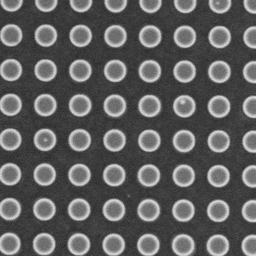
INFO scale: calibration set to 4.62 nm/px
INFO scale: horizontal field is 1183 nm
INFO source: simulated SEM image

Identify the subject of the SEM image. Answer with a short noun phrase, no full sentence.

an array of small figures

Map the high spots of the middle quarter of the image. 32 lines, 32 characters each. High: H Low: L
LLHHHHHLLLHHHHHLLLLHHHHHLLLLHHHH
LHHHHHHLLLHHHHHLLLLHHHHHLLLLHHHH
LHHHHHHLLLHHHHHLLLLHHHHHLLLLHHHH
LLHHHHLLLLLHHHHLLLLHHHHHLLLLHHHH
LLLLLLLLLLLLLLLLLLLLLLLLLLLLLLHL
LLLLLLLLLLLLLLLLLLLLLLLLLLLLLLLL
LLLLLLLLLLLLLLLLLLLLLLLLLLLLLLLL
LLLLLLLLLLLLLLLLLLLLLLLLLLLLLLLL
LLHHHHLLLLLHHHHLLLLLHHHLLLLLHHHH
LHHHHHHLLLHHHHHLLLLHHHHHLLLLHHHH
LHHHHHHLLLHHHHHLLLLHHHHHLLLHHHHH
LLHHHHLLLLHHHHHLLLLHHHHHLLLLHHHH
LLHHHHLLLLLHHHLLLLLLHHHLLLLLHHHH
LLLLLLLLLLLLLLLLLLLLLLLLLLLLLLLL
LLLLLLLLLLLLLLLLLLLLLLLLLLLLLLLL
LLLLLLLLLLLLLLLLLLLLLLLLLLLLLLLL
LLLHHLLLLLLLLLLLLLLLLLLLLLLLLLLL
LLHHHHLLLLHHHHHLLLLHHHHLLLLLHHHH
LHHHHHHLLLHHHHHLLLLHHHHHLLLHHHHH
LHHHHHHLLLHHHHHLLLLHHHHHLLLHHHHH
LLHHHHLLLLHHHHHLLLLHHHHHLLLLHHHH
LLLHHLLLLLLHHHLLLLLLHHHLLLLLHHHH
LLLLLLLLLLLLLLLLLLLLLLLLLLLLLLLL
LLLLLLLLLLLLLLLLLLLLLLLLLLLLLLLL
LLLLLLLLLLLLLLLLLLLLLLLLLLLLLLLL
LLHHHLLLLLLHHHLLLLLLHHHLLLLLLHHL
LHHHHHLLLLHHHHHLLLLHHHHLLLLLHHHH
LHHHHHLLLLHHHHHLLLLHHHHHLLLHHHHH
LHHHHHLLLLHHHHHLLLLHHHHHLLLHHHHH
LLHHHHLLLLHHHHHLLLLHHHHLLLLLHHHH
LLLLLLLLLLLLLLLLLLLLLLLLLLLLLHHL
LLLLLLLLLLLLLLLLLLLLLLLLLLLLLLLL